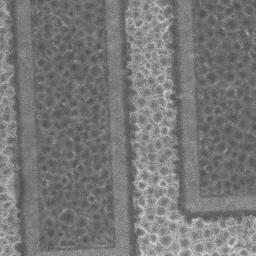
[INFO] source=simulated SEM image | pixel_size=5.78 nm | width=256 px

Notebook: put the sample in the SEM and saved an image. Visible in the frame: one or a few lines or trenches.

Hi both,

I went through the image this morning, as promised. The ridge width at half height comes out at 0.514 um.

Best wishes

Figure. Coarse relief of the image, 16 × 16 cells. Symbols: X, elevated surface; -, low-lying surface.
-XXXXXX-----XXXX
-XXXXXX-----XXXX
--XXXXX-----XXXX
--XXXXX-----XXXX
--XXXXX-----XXXX
--XXXXX-----XXXX
--XXXXX-----XXXX
--XXXXX-----XXXX
--XXXXX-----XXXX
--XXXXX-----XXXX
--XXXXX-----XXXX
--XXXXXX----XXXX
--XXXXXX----XXXX
--XXXXXX--------
--XXXXXX--------
--XXXXXX--------